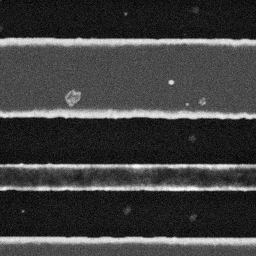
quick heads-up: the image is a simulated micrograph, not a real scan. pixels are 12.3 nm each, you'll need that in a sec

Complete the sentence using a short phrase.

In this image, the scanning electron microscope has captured lines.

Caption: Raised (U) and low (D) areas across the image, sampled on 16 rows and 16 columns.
DDDDDDDDDDDDDDDD
DDDDDDDDDDDDDDDD
UUUUUUDDUDDDDDDD
UUUUUUUUUUUUUUUU
UUUUUUUUUUUUUUUU
UUUUUUUUUUUUUUUU
UUUUUUUUUUUUUUUU
DDDDDDDDDDDDDDDD
DDDDDDDDDDDDDDDD
DDDDDDDDDDDDDDDD
UUUUUUUUUUUUUUUU
UUUUUUUUUUUUUUUU
DDDDDDDDDDDDDDDD
DDDDDDDDDDDDDDDD
DDDDDDDDDDDDDDDD
UUUUUUUUUUUUUUUU